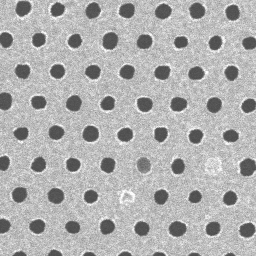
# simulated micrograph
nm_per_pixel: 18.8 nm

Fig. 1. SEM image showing a regular array of holes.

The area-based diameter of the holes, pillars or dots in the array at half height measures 0.289 micrometres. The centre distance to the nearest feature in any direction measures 646 nm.